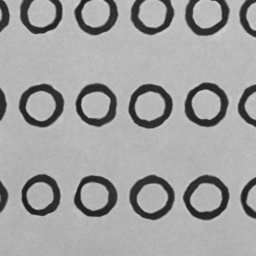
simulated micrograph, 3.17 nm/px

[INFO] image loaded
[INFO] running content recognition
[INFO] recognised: ring-shaped grooves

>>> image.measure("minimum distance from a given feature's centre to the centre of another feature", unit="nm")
172